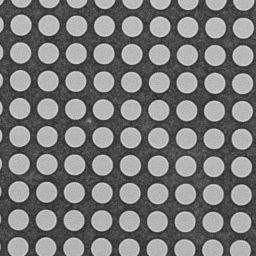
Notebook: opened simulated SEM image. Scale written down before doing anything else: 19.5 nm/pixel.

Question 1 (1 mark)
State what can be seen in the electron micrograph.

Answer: an array of small figures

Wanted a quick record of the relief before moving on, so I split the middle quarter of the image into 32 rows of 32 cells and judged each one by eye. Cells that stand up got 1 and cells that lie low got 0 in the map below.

00000000000000000000000000000000
00000000000000000000000000000000
01111000111100011100000110000111
01111000111100011110001111001111
01111000111100111110011111001111
01111000111100011110011111001111
00110000111100011100001111000111
00000000000000000000000000000000
00000000000000000000000000000000
01111000111000011100001110000111
11111001111100111110011111001111
11111001111100111110011111001111
01111001111100111110011111001111
00110000111000011100001110000111
00000000000000000000000000000000
00000000000000000000000000000000
01111000111100011100001110000111
11111001111100111110011111001111
11111001111100111110011111001111
01111001111100111110011111001111
00110000111000011100001110000111
00000000000000000000000000000000
00000000000000000000000000000000
01111000111000011100001110000111
11111001111100111110011111001111
11111001111100111110011111001111
11111001111100111110011111001111
00110000111000011100001110000111
00000000000000000000000000000000
00000000000000000000000000000000
01111000111000011100001110000111
11111001111100111110011111001111